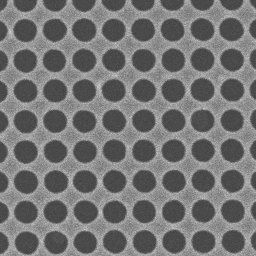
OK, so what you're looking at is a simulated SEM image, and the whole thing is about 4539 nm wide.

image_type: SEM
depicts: a regular array of holes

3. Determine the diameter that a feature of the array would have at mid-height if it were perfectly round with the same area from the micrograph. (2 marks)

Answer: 24.1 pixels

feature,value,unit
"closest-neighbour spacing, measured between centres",29.4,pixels